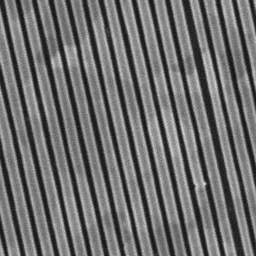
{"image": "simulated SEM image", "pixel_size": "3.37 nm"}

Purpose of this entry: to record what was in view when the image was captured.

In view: parallel lines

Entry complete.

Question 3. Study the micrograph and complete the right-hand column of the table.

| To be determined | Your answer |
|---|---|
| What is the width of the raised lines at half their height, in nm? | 32.6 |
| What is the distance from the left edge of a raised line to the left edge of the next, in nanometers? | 54.9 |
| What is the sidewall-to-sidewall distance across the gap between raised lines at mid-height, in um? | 0.0226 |